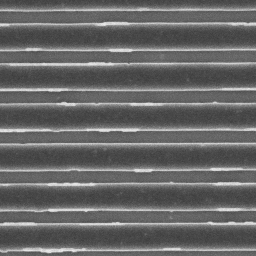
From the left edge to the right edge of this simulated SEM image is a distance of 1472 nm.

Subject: parallel lines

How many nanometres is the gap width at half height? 71.9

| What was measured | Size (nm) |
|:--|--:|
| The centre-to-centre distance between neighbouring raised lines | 230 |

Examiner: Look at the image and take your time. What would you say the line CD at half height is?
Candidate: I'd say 0.16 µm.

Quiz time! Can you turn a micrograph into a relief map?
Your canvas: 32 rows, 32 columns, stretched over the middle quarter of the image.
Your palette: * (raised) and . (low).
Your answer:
********************************
********************************
********************************
********************************
********************************
********************************
................*****...........
................................
................................
................................
********************************
********************************
********************************
********************************
********************************
********************************
********************************
................................
................................
................................
********************************
********************************
********************************
********************************
********************************
********************************
..............*************.....
................................
................................
................................
********************************
********************************